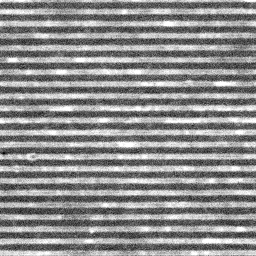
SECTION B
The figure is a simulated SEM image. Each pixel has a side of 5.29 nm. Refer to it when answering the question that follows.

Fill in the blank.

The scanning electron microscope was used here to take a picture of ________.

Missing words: parallel lines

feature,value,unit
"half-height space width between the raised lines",8.37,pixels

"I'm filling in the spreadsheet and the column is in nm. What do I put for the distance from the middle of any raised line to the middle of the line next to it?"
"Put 63.8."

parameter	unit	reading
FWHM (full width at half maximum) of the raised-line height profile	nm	18.5